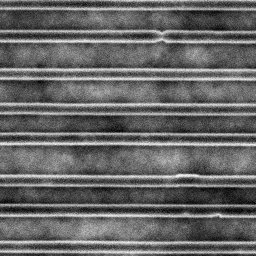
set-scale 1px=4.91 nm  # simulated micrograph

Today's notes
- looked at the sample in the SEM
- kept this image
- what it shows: parallel lines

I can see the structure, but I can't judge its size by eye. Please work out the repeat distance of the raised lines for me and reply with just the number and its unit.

0.172 µm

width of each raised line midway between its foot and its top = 56.4 nm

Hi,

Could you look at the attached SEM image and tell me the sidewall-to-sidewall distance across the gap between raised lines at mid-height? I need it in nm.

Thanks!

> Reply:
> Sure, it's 118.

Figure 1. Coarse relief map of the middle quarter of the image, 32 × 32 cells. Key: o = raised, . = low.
................................
oooooooooooooooooooooooooooooooo
oooooooooooooooooooooooooooooooo
oooooooooooooooooooooooooooooooo
................................
................................
................................
................................
................................
................................
oooooooooooooooooooooooooooooooo
oooooooooooooooooooooooooooooooo
............oooooooooooooooooooo
................................
................................
................................
................................
oooooooooooooooooooooooooooooooo
oooooooooooooooooooooooooooooooo
oooooooooooooooooooooooooooooooo
................................
................................
................................
................................
................................
................................
................................
................................
oooooooooooooooooooooooooooooooo
oooooooooooooooooooooooooooooooo
.ooo.oooooooooooooooooooooooo...
................................